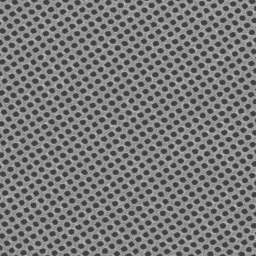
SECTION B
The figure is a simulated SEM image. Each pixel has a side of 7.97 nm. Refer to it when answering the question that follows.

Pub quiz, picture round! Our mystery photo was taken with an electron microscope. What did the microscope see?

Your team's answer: a regular array of holes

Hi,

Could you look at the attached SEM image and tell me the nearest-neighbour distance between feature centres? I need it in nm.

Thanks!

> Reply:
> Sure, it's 66.6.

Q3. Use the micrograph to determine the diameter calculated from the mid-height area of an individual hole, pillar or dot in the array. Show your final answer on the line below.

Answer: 50.1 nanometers